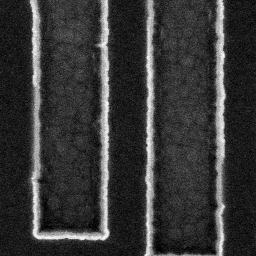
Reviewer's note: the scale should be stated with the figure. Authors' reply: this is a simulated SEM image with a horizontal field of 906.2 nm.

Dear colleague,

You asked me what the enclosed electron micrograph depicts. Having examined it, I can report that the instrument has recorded one or a few lines or trenches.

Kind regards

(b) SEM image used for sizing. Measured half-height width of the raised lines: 0.174 micrometres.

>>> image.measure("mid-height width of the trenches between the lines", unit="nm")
234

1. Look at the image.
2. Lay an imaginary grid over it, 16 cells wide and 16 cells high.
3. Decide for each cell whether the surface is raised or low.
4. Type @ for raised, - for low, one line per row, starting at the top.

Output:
@@----@@@-----@@
@@----@@@-----@@
@@----@@@-----@@
@@----@@@-----@@
@@----@@@-----@@
@@----@@@@----@@
@@----@@@@----@@
@@----@@@-----@@
@@----@@@-----@@
@@----@@@@----@@
@@----@@@-----@@
@@----@@@-----@@
@@----@@@-----@@
@@----@@@-----@@
@@@---@@@-----@@
@@@@@@@@@-----@@